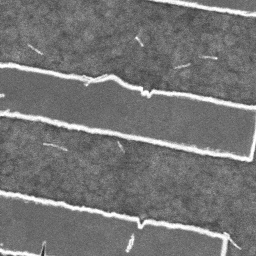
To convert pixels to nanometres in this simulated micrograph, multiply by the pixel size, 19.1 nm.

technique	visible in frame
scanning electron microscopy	one or a few lines or trenches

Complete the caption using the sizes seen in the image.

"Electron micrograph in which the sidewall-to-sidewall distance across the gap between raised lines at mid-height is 1.52 µm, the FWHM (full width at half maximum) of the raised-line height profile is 972 nm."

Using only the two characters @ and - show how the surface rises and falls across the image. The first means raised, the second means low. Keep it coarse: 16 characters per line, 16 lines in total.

-------------@@@
----------------
----------------
----------------
@@@-------------
@@@@@@@@--------
@@@@@@@@@@@@@@--
---@@@@@@@@@@@@@
--------@@@@@@@@
-------------@@@
----------------
----------------
@@--------------
@@@@@@@---------
@@@@@@@@@@@@@---
@@@@@@@@@@@@@@--